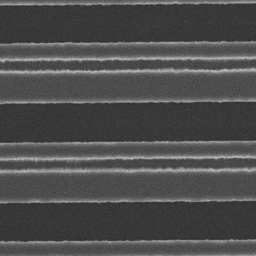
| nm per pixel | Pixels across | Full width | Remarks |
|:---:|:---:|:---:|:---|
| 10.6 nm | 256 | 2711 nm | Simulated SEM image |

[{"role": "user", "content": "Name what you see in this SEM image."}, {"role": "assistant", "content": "lines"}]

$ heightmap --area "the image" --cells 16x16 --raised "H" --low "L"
LLLLLLLLLLLLLLLL
LLLLLLLLLLLLLLLL
LLLLLLLLLLLLLLLL
HHHHHHHHHHHHHHHH
HHHHHHHHHHHHHHHH
HHHHHHHHHHHHHHHH
LLLLLLLLLLLLLLLL
LLLLLLLLLLLLLLLL
LLLLLLLLLLLLLLLL
HHHHHHHHHHHHHHHH
HHHHHHHHHHHHHHHH
HHHHHHHHHHHHHHHH
HHHHHHHHHHHHHHHH
LLLLLLLLLLLLLLLL
LLLLLLLLLLLLLLLL
HHHHHHHHHHHHHHHH